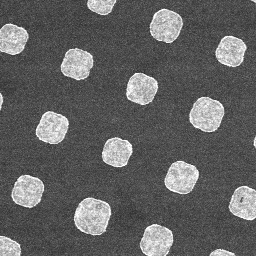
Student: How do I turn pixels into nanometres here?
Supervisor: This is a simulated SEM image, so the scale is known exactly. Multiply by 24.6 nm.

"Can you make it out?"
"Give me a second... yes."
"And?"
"a regular array of raised bodies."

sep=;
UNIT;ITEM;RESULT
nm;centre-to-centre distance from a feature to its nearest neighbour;1670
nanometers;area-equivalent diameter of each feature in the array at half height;767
